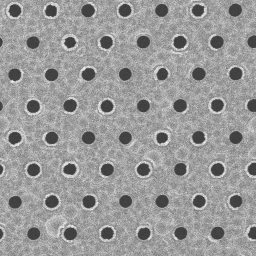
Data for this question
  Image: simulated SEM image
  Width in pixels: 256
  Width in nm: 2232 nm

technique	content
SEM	a regular array of holes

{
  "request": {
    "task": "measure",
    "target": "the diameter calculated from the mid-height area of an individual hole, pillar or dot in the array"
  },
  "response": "114 nm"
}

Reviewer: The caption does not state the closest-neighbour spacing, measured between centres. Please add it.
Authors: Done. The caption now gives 318 nm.